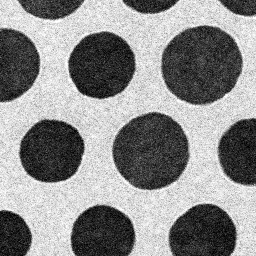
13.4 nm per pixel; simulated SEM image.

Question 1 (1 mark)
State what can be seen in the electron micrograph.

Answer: holes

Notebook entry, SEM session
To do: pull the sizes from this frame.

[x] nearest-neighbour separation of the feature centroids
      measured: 1330 nanometers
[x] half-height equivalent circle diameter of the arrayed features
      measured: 0.98 µm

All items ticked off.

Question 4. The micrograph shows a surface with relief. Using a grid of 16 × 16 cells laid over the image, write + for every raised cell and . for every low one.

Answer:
+....+++...+++..
++++++++++++++++
..+++...+++....+
..++....++.....+
..++....++.....+
..+++...++.....+
++++++++++++.+++
+++.++++...++++.
++...++.....++..
+....++.....++..
+....++.....++..
++++++++...++++.
++++++++++++++++
.++++...+++...++
..++....+++....+
..+++...+++....+